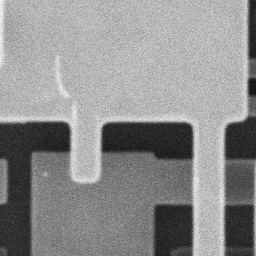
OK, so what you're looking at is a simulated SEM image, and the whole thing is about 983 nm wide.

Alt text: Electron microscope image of wiring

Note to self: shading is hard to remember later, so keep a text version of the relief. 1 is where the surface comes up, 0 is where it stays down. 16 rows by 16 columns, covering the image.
1111111111111110
1111111111111110
1111111111111110
1111111111111110
1111111111111110
1111111111111110
1111111111111110
1111111111111110
0000110000001100
0000110000001100
0000110000001100
0000000000001100
0000000000001100
0000000000001100
0000000000001100
0000000000001100